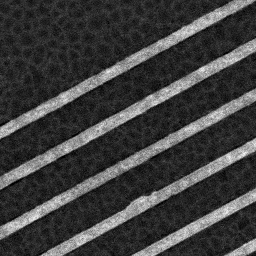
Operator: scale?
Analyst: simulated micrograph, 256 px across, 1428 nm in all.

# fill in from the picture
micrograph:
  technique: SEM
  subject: parallel lines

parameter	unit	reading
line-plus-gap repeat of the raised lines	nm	245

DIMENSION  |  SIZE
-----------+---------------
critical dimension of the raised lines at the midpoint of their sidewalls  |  57.7 nm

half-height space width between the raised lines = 33.7 pixels